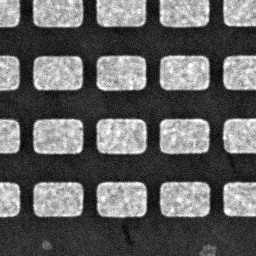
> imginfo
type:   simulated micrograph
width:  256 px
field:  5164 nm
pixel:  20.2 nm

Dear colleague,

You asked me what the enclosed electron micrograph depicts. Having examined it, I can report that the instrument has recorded wiring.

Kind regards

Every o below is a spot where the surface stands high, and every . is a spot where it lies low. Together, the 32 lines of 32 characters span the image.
oo..oooooo..oooooo..oooooo..oooo
oo..oooooo..oooooo..oooooo..oooo
oo..oooooo..oooooo..oooooo..oooo
................................
................................
................................
................................
oo...ooooo..oooooo..oooooo..oooo
oo..oooooo..oooooo..oooooo..oooo
oo..oooooo..oooooo..oooooo..oooo
oo..oooooo..oooooo..oooooo..oooo
................................
................................
................................
................................
oo..oooooo..oooooo..oooooo..oooo
oo..oooooo..oooooo..oooooo..oooo
oo..oooooo..oooooo..oooooo..oooo
oo..oooooo..oooooo..oooooo..oooo
................................
................................
................................
................................
oo..oooooo..oooooo..oooooo..oooo
oo..oooooo..oooooo..oooooo..oooo
oo..oooooo..oooooo..oooooo..oooo
oo..oooooo..oooooo..oooooo..oooo
................................
................................
................................
................................
................................